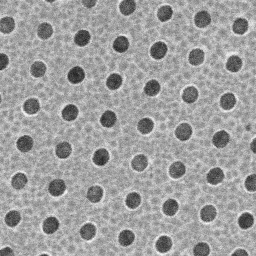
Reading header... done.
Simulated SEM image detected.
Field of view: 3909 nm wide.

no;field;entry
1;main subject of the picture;a regular array of holes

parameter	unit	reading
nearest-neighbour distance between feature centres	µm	0.575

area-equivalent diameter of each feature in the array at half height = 0.277 µm